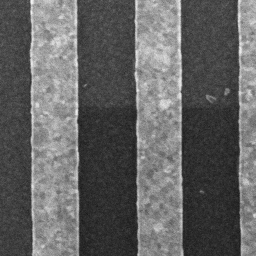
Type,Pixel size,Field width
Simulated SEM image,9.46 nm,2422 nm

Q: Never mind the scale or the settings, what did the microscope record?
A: lines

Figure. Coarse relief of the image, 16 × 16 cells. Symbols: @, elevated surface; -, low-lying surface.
--@@@----@@----@
--@@@----@@----@
--@@@----@@----@
--@@@----@@----@
--@@@----@@----@
--@@@----@@----@
--@@@----@@----@
--@@@----@@----@
--@@@----@@----@
--@@@----@@----@
--@@@----@@----@
--@@@----@@----@
--@@@----@@----@
--@@@----@@----@
--@@@----@@----@
--@@@----@@----@